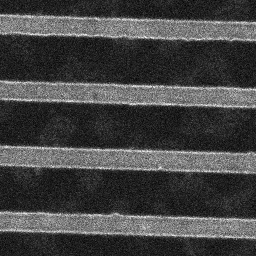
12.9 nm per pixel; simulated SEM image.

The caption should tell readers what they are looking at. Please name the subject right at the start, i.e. one or a few lines or trenches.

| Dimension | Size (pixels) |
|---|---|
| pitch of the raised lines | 65.6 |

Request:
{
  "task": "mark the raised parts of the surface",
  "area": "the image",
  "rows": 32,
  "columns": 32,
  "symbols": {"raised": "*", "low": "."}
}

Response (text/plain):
********************************
********************************
.................*..************
................................
*************..*................
********************************
********************************
********************************
********************************
********************************
.........***********************
................................
**..............................
********************************
********************************
********************************
********************************
********************************
.....***************************
................................
................................
****************************....
********************************
********************************
********************************
********************************
********************************
...............................*
................................
************************........
********************************
********************************